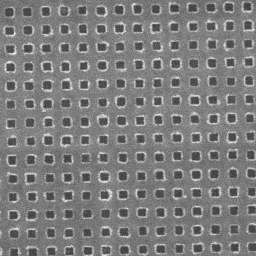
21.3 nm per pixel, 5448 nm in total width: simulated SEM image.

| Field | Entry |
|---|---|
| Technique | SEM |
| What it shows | a regular array of holes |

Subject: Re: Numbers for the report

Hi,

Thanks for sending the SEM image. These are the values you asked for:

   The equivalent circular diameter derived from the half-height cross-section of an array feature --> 201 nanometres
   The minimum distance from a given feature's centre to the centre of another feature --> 384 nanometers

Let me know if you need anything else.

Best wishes